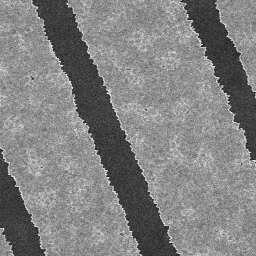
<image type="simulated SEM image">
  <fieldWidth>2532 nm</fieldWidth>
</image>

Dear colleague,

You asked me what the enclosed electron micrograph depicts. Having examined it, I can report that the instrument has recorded one or a few lines or trenches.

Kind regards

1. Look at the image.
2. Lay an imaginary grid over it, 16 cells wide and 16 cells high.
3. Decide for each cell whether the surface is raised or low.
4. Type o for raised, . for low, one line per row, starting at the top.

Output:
oo..oooooooo..oo
ooo..ooooooo..oo
ooo..ooooooo..oo
oooo..ooooooo..o
oooo..ooooooo..o
oooo...ooooooo..
ooooo..ooooooo..
ooooo..oooooooo.
oooooo..ooooooo.
oooooo..oooooooo
.ooooo...ooooooo
.oooooo..ooooooo
.oooooo...oooooo
..oooooo..oooooo
..oooooo...ooooo
o..oooooo..ooooo